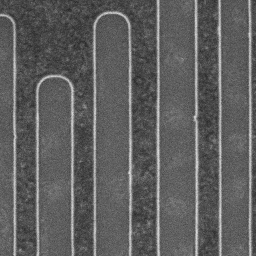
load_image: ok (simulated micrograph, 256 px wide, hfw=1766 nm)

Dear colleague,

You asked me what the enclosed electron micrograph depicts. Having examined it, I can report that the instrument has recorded parallel lines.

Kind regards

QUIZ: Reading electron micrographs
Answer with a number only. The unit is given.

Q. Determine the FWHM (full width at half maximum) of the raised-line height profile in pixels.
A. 24.1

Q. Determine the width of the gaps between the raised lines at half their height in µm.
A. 0.239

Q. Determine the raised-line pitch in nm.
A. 420